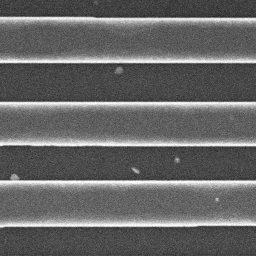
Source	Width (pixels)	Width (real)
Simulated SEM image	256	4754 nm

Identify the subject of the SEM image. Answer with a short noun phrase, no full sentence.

lines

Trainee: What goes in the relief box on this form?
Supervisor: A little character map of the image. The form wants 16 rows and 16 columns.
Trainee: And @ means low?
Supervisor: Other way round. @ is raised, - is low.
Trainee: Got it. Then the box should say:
----------------
@@@@@@@@@@@@@@@@
@@@@@@@@@@@@@@@@
@@@@@@@@@@@@@@@@
----------------
----------------
@@@@@@@@@@@@@@@@
@@@@@@@@@@@@@@@@
@@@@@@@@@@@@@@@@
----------------
----------------
@@@@@@@@@@@@@@@@
@@@@@@@@@@@@@@@@
@@@@@@@@@@@@@@@@
----------------
----------------